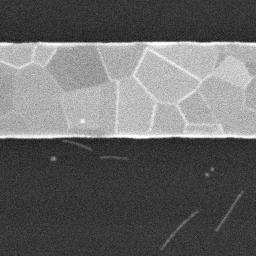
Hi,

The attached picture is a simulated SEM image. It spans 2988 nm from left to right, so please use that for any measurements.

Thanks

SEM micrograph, wiring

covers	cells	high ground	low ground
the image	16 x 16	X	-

----------------
----------------
----------------
XXXXXXXXXXXXXXXX
XXXXXXXXXXXXXXXX
XXXXXXXXXXXXXXXX
XXXXXXXXXXXXXXXX
XXXXXXXXXXXXXXXX
XXXXXXXXXXXXXXXX
----------------
----------------
----------------
----------------
----------------
----------------
----------------